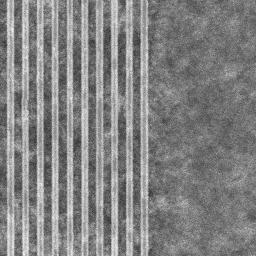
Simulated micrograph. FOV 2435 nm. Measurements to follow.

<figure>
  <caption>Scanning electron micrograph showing parallel lines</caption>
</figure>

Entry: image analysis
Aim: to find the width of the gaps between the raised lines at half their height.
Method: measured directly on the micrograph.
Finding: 96.3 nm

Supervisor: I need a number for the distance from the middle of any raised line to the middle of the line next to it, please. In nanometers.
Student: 141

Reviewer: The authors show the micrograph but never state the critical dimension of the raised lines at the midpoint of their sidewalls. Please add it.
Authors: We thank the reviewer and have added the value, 52.3 nm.